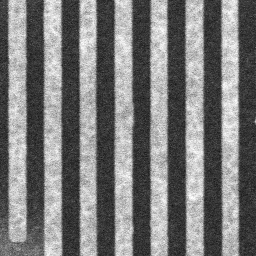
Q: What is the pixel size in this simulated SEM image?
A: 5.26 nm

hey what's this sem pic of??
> parallel lines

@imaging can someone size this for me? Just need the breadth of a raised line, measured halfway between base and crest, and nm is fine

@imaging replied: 92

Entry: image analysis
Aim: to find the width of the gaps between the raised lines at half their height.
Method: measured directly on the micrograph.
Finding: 97.3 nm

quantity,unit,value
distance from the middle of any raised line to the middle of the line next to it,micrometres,0.186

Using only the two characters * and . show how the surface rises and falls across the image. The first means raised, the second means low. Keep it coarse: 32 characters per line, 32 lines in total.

.**...**..**..**...**..**...**..
.**..***..**..**...**..**...**..
.**..***..**..**...**..**...**..
.**..***..**..**...**..**...**..
.**..***..**..**...**..**...**..
.**...**..**..**...**..**...**..
.**..***..**..**...**..**...**..
.**...**..**..**...**..**...**..
.**...**..**..**...**..**...**..
.**...**..**..**...**..**...**..
.**...**..**..**...**..**...**..
.**...**..**..**...**..**...**..
.**...**..**..***..**..**...**..
.**...**..**..***..**..**...**..
.**...**..**..***..**..**...**..
.**...**..**..***..**..**...**..
.**...**..**..**...**..**...**..
.**...**..**..**...**..**...**..
.**...**..**..**...**..**...**..
.**...**..**..**...**..**...**..
.**...**..**..**...**..**...**..
.**...**..**..**...**..**...**..
.**...**..**..**...**..**...**..
.**...**..**..**...**..**...**..
.**...**..**..**...**..**...**..
.**...**..**..**...**..**...**..
.**...**..**..**...**..**...**..
.**...**..**..**...**..**...**..
.**...**..**..***..**..**...**..
.**...**..**..**...**..**...**..
......**..**..**...**..**...**..
......**..**..**...**..**...**..